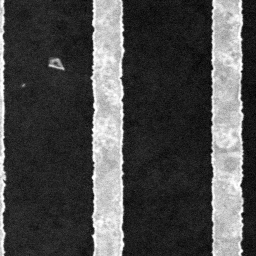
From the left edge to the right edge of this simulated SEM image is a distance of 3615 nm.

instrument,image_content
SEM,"one or a few lines or trenches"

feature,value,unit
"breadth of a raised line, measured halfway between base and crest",397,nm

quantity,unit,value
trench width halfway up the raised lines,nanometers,1290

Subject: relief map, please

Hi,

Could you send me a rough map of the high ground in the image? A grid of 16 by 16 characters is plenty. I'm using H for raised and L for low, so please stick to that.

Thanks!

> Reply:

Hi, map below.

LLLLLLHHLLLLLHHL
LLLLLLHHLLLLLHHL
LLLLLLHHLLLLLHHL
LLLLLLHHLLLLLHHL
LLLLLLHHLLLLLHHL
LLLLLLHHLLLLLHHL
LLLLLLHHLLLLLHHL
LLLLLLHHLLLLLHHL
LLLLLLHHLLLLLHHL
LLLLLLHHLLLLLHHL
LLLLLLHHLLLLLHHL
LLLLLLHHLLLLLHHL
LLLLLLHHLLLLLHHL
LLLLLLHHLLLLLHHL
LLLLLLHHLLLLLHHL
LLLLLLHHLLLLLHHL